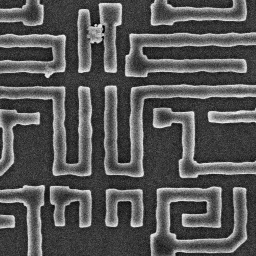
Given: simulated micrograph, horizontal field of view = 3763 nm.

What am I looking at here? wiring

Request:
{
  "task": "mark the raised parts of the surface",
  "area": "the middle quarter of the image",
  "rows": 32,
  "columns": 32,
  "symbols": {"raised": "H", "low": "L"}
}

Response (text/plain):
LLLLHHHLLLHHHLLHHHHHHHHHHHHHHHHH
LLLLHHLLLLHHHLLHHHHHHHHHHHHHHHHH
LLLLLLLLLLLLLLLHHHHHHLLLLLLLLLLL
LLLLLLLLLLLLLLLLLLLLLLLLLLLLLLLL
LLLLLLLLLLLLLLLLLLLLLLLLLLLLLLLL
LLLLLLLLLLLHLLLLLLLLLHHHHHHHHHHH
LLLLHHLLLLHHHLLLLHHHHHHHHHHHHHHH
LLLLHHLLLLHHHLLLLHHHHHHHHHHHHHHH
LLLLHHLLLLHHHLLLLHHHHLLLLLLLLLLL
LLLLHHHLLLHHHLLLLHHHLLLLLLLLLLLL
LLLLHHHLLLHHHLLLLHHHLLLLLLLLLLLL
LLLLHHHLLLHHHLLLLHHLLLHHHHHLLLLL
LLLLHHHLLLHHHLLLLHHLLLHHHHHHHHHH
LLLLHHHLLLHHHLLLLHHLLLHHHHHHHHHH
LLLLHHLLLLHHHLLLLHHLLLHHHHHHHHHH
LLLLHHHLLLHHHLLLLHHLLLLHHHLLLLHH
LLLLHHHLLLHHHLLLLHHLLLLLLLLLLLHH
LLLLHHHLLLHHHLLLLHHHLLLLLLLLLLHH
LLLLHHHLLLHHHLLLLHHHLLLLLLLLLLHH
LLLLHHHLLLHHHLLLLHHLLLLLLLLLLLHH
LLLLHHHLLLHHHLLLLHHHLLLLLLLLLLHH
LLLLHHHLLLHHHLLLLHHHLLLLLLLLLLHH
LLLLHHHLLLHHHLLLLHHHLLLLLLLLLLHH
LLLLHHHLLLHHHLLLLHHLLLLLLLLLLHHH
LLLLHHHLLLHHHHLLLHHLLLLLLLLLLHHH
HHHHHHHLLLHHHHHHHHHLLLLLLLLLLHHH
HHHHHHHLLLHHHHHHHHHHLLLLLLLLLHHH
LLHHHHLLLLLLLLHHHHHHLLLLLLLLLHHH
LLLLLLLLLLLLLLLLLLLLLLLLLLLLLLLL
LLLLLLLLLLLLLLLLLLLLLLLLLLLLLLLL
LLLLLLLLLLLLLLLLLLLLLLLLLLLLLLLL
HHHHLLLLLLLHHHLLLLHLLLLHHHHHHHHH